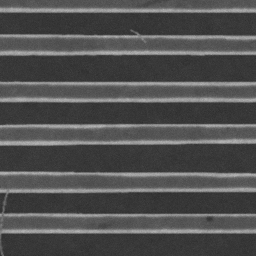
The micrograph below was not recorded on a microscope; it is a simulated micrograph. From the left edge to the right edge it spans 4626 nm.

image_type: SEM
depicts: lines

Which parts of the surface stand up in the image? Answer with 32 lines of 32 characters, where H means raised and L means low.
HHHHHHHHHHHHHHHHHHHHHHHHHHHHHHHH
LLLLLLLLLLLLLLLLLLLLLLLLLLLLLLLL
LLLLLLLLLLLLLLLLLLLLLLLLLLLLLLLL
LLLLLLLLLLLLLLLLLLLLLLLLLLLLLLLL
HHHHHHHHHHHHHHHHLHLLLLLLLLLLLLLL
HHHHHHHHHHHHHHHHHHHHHHHHHHHHHHHH
HHHHHHHHHHHHHHHHHHHHHHHHHHHHHHHH
LLLLLLLLLLLLLLLLLLLLLLLLLLLLLLLL
LLLLLLLLLLLLLLLLLLLLLLLLLLLLLLLL
LLLLLLLLLLLLLLLLLLLLLLLLLLLLLLLL
HHHHHHHHHHHHHHHHHHHHHHHHHHHHHHHH
HHHHHHHHHHHHHHHHHHHHHHHHHHHHHHHH
HHHHHHHHHHHHHHHHHHHHHHHHHHHHHHHH
LLLLLLLLLLLLLLLLLLLLLLLLLLLLLLLL
LLLLLLLLLLLLLLLLLLLLLLLLLLLLLLLL
LLLLLLLLLLLLLLLLLLLLLLLLLLLLLLLL
HHHHHHHHHHHHHHHHHHHHHHHHHHHHHHHH
HHHHHHHHHHHHHHHHHHHHHHHHHHHHHHHH
LLLLLLLLLLLLLLLLLLLLLLLLLLLLLLLL
LLLLLLLLLLLLLLLLLLLLLLLLLLLLLLLL
LLLLLLLLLLLLLLLLLLLLLLLLLLLLLLLL
LLLLLLLLLLLLLLLLLLLLLLLLLLLLLLLL
HHHHHHHHHHHHHHHHHHHHHHHHHHHHHHHH
HHHHHHHHHHHHHHHHHHHHHHHHHHHHHHHH
LLLLLLLLLLLLLLLLLLLLLLLLLLLLLLLL
LLLLLLLLLLLLLLLLLLLLLLLLLLLLLLLL
LLLLLLLLLLLLLLLLLLLLLLLLLLLLLLLL
HHHHHHHHHHHHHHHHHHHHHHHHHHHHHHHH
HHHHHHHHHHHHHHHHHHHHHHHHHHHHHHHH
LLLLLLLLLLLLLLLLLLLLLLLLLLLLLLLL
LLLLLLLLLLLLLLLLLLLLLLLLLLLLLLLL
LLLLLLLLLLLLLLLLLLLLLLLLLLLLLLLL